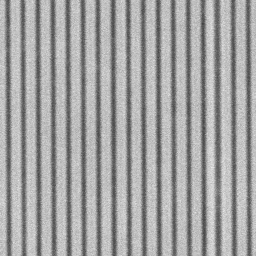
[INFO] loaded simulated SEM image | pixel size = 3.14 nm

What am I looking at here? parallel lines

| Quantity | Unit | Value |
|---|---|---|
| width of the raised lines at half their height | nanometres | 31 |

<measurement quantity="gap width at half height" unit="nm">16.9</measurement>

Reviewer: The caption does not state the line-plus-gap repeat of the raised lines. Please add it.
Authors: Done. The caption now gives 47.2 nm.